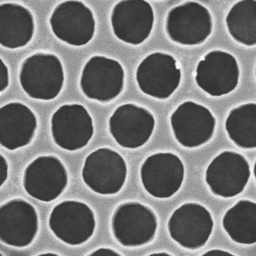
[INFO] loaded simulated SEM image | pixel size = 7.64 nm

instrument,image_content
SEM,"a regular array of holes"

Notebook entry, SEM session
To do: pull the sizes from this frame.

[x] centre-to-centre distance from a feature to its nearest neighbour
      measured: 0.433 microns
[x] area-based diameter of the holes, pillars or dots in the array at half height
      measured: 340 nanometers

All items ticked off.